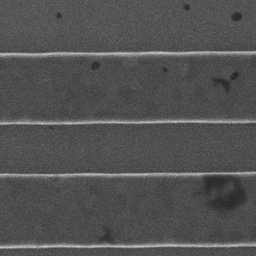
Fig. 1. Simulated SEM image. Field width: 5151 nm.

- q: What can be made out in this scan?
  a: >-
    wiring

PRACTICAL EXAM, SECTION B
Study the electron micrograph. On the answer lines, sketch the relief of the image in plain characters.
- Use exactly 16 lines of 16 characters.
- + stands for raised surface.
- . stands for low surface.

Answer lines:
................
................
................
++++++++++++++++
++++++++++++++++
++++++++++++++++
++++++++++++++++
++++++++++++++++
................
................
................
++++++++++++++++
++++++++++++++++
++++++++++++++++
++++++++++++++++
................